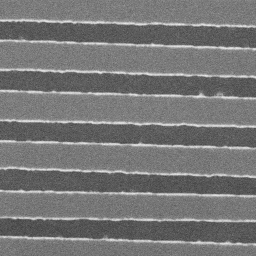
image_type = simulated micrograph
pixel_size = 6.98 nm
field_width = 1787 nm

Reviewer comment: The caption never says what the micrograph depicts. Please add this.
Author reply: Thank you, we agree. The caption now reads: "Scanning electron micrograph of lines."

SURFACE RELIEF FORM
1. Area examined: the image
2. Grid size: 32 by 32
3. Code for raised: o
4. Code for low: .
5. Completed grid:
oooooooooooooooooooooooooooooooo
oooooooooooooooooooooooooooooooo
oooooooooooooooooooooooooooooooo
................................
................................
ooooooooooooo...................
oooooooooooooooooooooooooooooooo
oooooooooooooooooooooooooooooooo
oooooooooooooooooooooooooooooooo
..........................oooooo
................................
oooooo..........................
oooooooooooooooooooooooooooooooo
oooooooooooooooooooooooooooooooo
oooooooooooooooooooooooooooooooo
................oooooooooooooooo
................................
................................
ooooooooooooooooooooooooooooooo.
oooooooooooooooooooooooooooooooo
oooooooooooooooooooooooooooooooo
.............o.ooooooooooooooooo
................................
................................
oooooooooooooooooooooooooooooooo
oooooooooooooooooooooooooooooooo
oooooooooooooooooooooooooooooooo
..............o..ooooooooooooooo
................................
................................
oooooooooooooooooooooooooooooo..
oooooooooooooooooooooooooooooooo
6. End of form